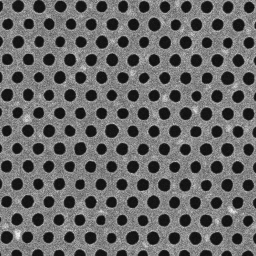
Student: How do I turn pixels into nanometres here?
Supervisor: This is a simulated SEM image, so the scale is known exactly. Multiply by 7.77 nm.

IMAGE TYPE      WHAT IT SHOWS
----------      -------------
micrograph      a regular array of holes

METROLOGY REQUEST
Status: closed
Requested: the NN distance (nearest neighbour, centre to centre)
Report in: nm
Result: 158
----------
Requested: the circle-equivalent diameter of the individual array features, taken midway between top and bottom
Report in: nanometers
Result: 89.5